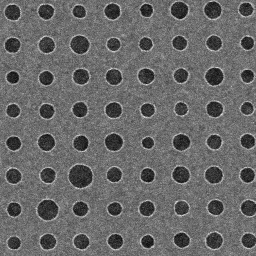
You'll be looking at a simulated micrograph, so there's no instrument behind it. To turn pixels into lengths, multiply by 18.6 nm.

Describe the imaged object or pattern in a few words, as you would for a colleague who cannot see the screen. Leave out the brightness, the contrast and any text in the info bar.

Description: a regular array of holes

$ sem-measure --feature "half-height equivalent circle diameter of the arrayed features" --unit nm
290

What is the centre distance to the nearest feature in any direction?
606 nanometres